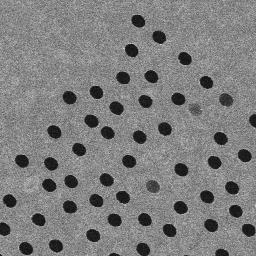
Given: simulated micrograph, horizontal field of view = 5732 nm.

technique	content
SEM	a regular array of holes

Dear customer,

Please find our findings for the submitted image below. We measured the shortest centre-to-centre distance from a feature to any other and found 590 nm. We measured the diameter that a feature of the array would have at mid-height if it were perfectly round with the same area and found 0.295 microns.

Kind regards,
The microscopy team